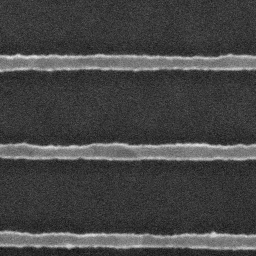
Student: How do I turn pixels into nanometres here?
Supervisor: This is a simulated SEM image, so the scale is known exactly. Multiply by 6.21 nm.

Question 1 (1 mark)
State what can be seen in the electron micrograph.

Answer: lines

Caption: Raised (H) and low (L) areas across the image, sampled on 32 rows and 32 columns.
LLLLLLLLLLLLLLLLLLLLLLLLLLLLLLLL
LLLLLLLLLLLLLLLLLLLLLLLLLLLLLLLL
LLLLLLLLLLLLLLLLLLLLLLLLLLLLLLLL
LLLLLLLLLLLLLLLLLLLLLLLLLLLLLLLL
LLLLLLLLLLLLLLLLLLLLLLLLLLLLLLLL
LLLLLLLLLLLLLLLLLLLLLLLLLLLLLLLL
LLLLLLLLLLLLLLLLLLLLLLLLLLLLLLLL
HHHHHHHHHHHHHHHHHHHHHHHHHHHHHHHH
HHHHHHHHHHHHHHHHHHHHHHHHHHHHHHHH
LLLLLLLLLLLLLLLLLLLLLLLLLLLLLLLL
LLLLLLLLLLLLLLLLLLLLLLLLLLLLLLLL
LLLLLLLLLLLLLLLLLLLLLLLLLLLLLLLL
LLLLLLLLLLLLLLLLLLLLLLLLLLLLLLLL
LLLLLLLLLLLLLLLLLLLLLLLLLLLLLLLL
LLLLLLLLLLLLLLLLLLLLLLLLLLLLLLLL
LLLLLLLLLLLLLLLLLLLLLLLLLLLLLLLL
LLLLLLLLLLLLLLLLLLLLLLLLLLLLLLLL
LLLLLLLLLLLLLLLLLLLLLLLLLLLLLLLL
HHHHHHHHHHHHHHHHHHHHHHHHHHHHHHHH
HHHHHHHHHHHHHHHHHHHHHHHHHHHHHHHH
LLLLLLLLLLLLLLLLLLLLLLLLLLLLLLLL
LLLLLLLLLLLLLLLLLLLLLLLLLLLLLLLL
LLLLLLLLLLLLLLLLLLLLLLLLLLLLLLLL
LLLLLLLLLLLLLLLLLLLLLLLLLLLLLLLL
LLLLLLLLLLLLLLLLLLLLLLLLLLLLLLLL
LLLLLLLLLLLLLLLLLLLLLLLLLLLLLLLL
LLLLLLLLLLLLLLLLLLLLLLLLLLLLLLLL
LLLLLLLLLLLLLLLLLLLLLLLLLLLLLLLL
LLLLLLLLLLLLLLLLLLLLLLLLLLLLLLLL
HHHHHHHHHHHHHHHHHHHHLLHHHHHHHHHH
HHHHHHHHHHHHHHHHHHHHHHHHHHHHHHHH
LLLLLLLLLLLLLLLLLLLLLLLLLLLLLLLL